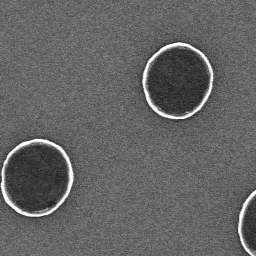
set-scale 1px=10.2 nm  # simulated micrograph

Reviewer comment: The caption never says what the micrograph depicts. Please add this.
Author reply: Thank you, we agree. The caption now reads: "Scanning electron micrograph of raised bodies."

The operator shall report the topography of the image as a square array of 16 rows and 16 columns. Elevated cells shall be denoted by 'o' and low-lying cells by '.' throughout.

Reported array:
................
................
................
..........ooo...
.........oooo...
.........oooo...
.........oooo...
................
................
.ooo............
oooo............
oooo............
oooo............
...............o
...............o
...............o